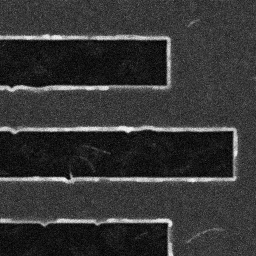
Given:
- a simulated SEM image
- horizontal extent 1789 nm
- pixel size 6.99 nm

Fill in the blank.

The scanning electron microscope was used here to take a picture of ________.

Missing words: one or a few lines or trenches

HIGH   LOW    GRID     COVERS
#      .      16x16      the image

################
################
..........######
..........######
..........######
################
################
################
...............#
...............#
...............#
################
################
################
...........#####
...........#####